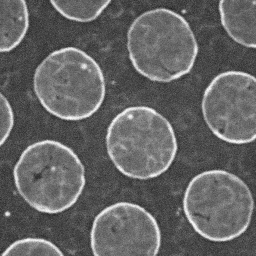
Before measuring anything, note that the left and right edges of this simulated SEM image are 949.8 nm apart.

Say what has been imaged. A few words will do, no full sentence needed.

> raised bodies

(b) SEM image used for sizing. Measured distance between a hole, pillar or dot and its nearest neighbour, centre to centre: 0.352 micrometres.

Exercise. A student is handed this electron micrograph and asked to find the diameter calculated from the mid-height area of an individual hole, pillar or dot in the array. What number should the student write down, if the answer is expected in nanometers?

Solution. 255